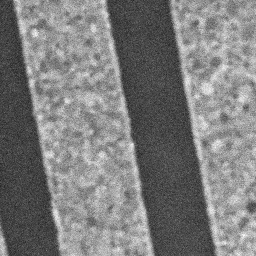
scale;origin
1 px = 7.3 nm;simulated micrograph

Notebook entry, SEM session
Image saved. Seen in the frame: one or a few lines or trenches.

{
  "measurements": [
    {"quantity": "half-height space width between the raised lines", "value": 499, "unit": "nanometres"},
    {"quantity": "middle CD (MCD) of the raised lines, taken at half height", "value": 0.615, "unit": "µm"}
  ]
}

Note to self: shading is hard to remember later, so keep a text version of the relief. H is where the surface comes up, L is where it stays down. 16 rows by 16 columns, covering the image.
LHHHHHHLLLLHHHHH
LHHHHHHLLLLHHHHH
LLHHHHHLLLLHHHHH
LLHHHHHLLLLHHHHH
LLHHHHHLLLLLHHHH
LLHHHHHLLLLLHHHH
LLHHHHHHLLLLHHHH
LLHHHHHHLLLLHHHH
LLLHHHHHLLLLHHHH
LLLHHHHHLLLLLHHH
LLLHHHHHLLLLLHHH
LLLHHHHHHLLLLHHH
LLLHHHHHHLLLLHHH
LLLLHHHHHLLLLHHH
LLLLHHHHHLLLLHHH
LLLLHHHHHLLLLLHH